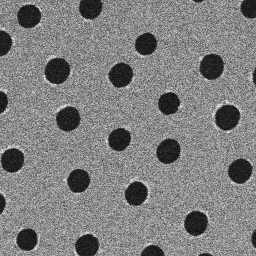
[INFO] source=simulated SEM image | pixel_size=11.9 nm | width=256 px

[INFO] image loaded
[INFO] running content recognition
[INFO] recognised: a regular array of holes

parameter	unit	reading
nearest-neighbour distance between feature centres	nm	635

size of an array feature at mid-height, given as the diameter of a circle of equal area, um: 0.288